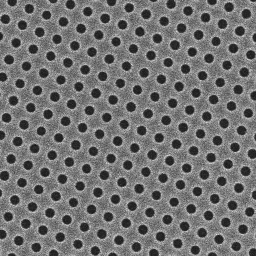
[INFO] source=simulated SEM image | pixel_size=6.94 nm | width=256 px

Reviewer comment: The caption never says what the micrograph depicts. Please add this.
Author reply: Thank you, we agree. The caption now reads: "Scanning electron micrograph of a regular array of holes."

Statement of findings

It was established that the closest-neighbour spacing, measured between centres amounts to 126 nm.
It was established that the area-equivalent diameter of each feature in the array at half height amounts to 0.0655 µm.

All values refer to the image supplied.